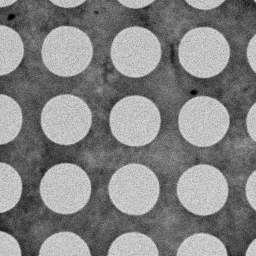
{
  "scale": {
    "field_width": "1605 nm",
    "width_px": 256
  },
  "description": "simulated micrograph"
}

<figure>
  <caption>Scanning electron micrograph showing an array of small figures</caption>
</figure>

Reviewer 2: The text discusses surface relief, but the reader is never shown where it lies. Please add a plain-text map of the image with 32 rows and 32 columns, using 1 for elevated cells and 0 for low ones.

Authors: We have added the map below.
10000001110000011110000011110000
00000000000000000000000000000000
00000000000000000000000000000000
10000001100000001100000001000000
11000011111000011110000111110000
11100111111000111111000111110001
11100111111100111111001111111001
11100111111000111111000111111001
11000011111000011110000111110000
00000000000000001100000011100000
00000000000000000000000000000000
00000000000000000000000000000000
11000011110000011110000011100000
11000011111000111111000111110001
11100111111000111111001111111001
11100111111000111111001111111001
11000011111000111111000111110001
10000011110000011110000111100000
00000000000000000000000000000000
00000000000000000000000000000000
10000000100000000000000000000000
11000011111000011110000111110000
11100111111000111111001111110001
11100111111000111111001111110001
11000111111000111111001111110001
11000011111000111110000111110001
00000001100000011100000011100000
00000000000000000000000000000000
00000000000000000000000000000000
10000011110000011100000011100000
11000111111000111110000111110001
11100111111000111111001111110001